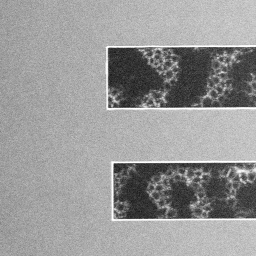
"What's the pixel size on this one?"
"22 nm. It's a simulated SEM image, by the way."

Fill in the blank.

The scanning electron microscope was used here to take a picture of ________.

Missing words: one or a few lines or trenches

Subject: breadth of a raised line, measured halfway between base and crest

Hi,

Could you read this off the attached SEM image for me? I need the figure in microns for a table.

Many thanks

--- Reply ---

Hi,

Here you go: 1.28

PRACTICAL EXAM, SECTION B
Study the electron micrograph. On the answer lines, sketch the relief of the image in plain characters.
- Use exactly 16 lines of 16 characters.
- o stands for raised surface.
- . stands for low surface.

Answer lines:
................
................
................
.......ooooooooo
.......ooooooooo
.......ooooooooo
.......ooooooooo
................
................
................
.......ooooooooo
.......ooooooooo
.......ooooooooo
.......ooooooooo
................
................